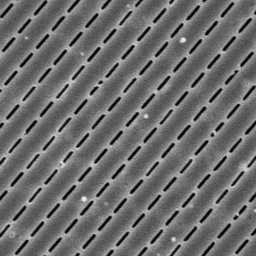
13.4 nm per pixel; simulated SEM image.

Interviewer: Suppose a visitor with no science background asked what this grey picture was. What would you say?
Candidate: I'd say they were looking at a regular array of holes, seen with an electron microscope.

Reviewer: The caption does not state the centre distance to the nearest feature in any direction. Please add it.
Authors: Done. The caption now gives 316 nanometers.